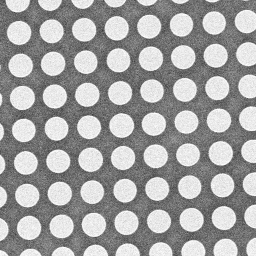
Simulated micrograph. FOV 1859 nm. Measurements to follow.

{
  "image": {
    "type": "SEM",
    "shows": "an array of small figures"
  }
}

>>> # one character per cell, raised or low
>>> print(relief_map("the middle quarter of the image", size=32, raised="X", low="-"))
---XXXXX---XXXXX---XXXXX----XXXX
---XXXXX----XXX------X----------
--------------------------------
--------------------------------
-------------XX-----XXXX----XXXX
----XXXX----XXXX---XXXXX----XXXX
---XXXXX---XXXXXX--XXXXXX--XXXXX
X--XXXXXX--XXXXXX--XXXXXX---XXXX
X--XXXXXX--XXXXXX---XXXX----XXXX
----XXXX----XXXX----------------
-----X--------------------------
--------------------------------
--------------X------XXX-----XXX
----XXXX----XXXXX---XXXXX---XXXX
----XXXXX---XXXXX---XXXXX---XXXX
X--XXXXXX--XXXXXX---XXXXX---XXXX
X---XXXXX---XXXXX---XXXXX---XXXX
X---XXXXX---XXXX-----XXX--------
-----XX-------------------------
--------------------------------
----------------------XX-----XXX
-----XXX-----XXXX---XXXXX---XXXX
X---XXXXX---XXXXX---XXXXXX--XXXX
X---XXXXX---XXXXXX--XXXXXX--XXXX
X---XXXXXX--XXXXX---XXXXX----XXX
X---XXXXX----XXXX----XXXX-------
-----XXX------------------------
--------------------------------
-----------------------X------XX
------XX-----XXXX----XXXXX---XXX
X----XXXX----XXXXX---XXXXX---XXX
XX--XXXXXX---XXXXX---XXXXX---XXX